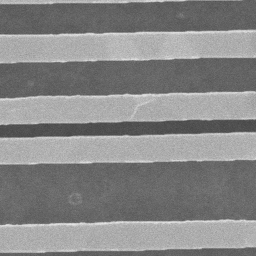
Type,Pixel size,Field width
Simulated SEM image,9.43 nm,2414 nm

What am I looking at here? lines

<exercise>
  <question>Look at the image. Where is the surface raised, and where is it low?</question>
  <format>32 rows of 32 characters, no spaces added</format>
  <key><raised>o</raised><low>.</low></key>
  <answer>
................................
................................
................................
................................
oooooooooooooooooooooooooooooooo
oooooooooooooooooooooooooooooooo
oooooooooooooooooooooooooooooooo
oooooooooooo....................
................................
................................
................................
...............................o
oooooooooooooooooooooooooooooooo
oooooooooooooooooooooooooooooooo
oooooooooooooooooooooooooooooooo
o...............................
................................
oooooooooooooooooooooooooooooooo
oooooooooooooooooooooooooooooooo
oooooooooooooooooooooooooooooooo
................................
................................
................................
................................
................................
................................
................................
................................
oooooooooooooooooooooooooooooooo
oooooooooooooooooooooooooooooooo
oooooooooooooooooooooooooooooooo
oooooo..........................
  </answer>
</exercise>